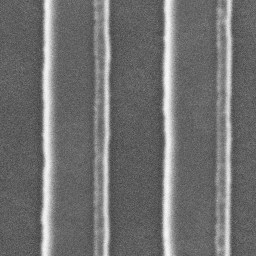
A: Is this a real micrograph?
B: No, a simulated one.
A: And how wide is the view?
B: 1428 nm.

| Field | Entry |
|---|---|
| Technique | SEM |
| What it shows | lines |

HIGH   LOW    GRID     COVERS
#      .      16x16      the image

...####...####..
...####...####..
...####...####..
...####...####..
...####...####..
...####...####..
...####...####..
...####...####..
...####...####..
...####...####..
...####...####..
...####...####..
...####...####..
...####...####..
...####...####..
...####...####..